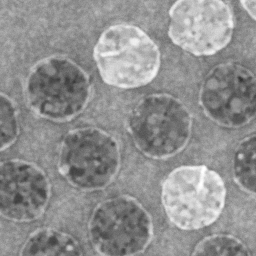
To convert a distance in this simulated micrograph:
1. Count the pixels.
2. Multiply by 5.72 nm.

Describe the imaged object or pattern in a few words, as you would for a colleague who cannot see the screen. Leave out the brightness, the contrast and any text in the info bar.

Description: raised bodies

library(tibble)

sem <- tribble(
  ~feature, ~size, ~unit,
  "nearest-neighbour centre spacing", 436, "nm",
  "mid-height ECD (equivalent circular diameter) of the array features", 355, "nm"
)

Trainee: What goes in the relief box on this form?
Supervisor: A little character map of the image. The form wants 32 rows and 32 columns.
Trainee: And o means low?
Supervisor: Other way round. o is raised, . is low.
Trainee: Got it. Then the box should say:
......................oooooo..oo
.....................oooooooo..o
.....................oooooooo...
..............ooo....oooooooo...
.............ooooo...oooooooo...
............ooooooo...oooooo....
............oooooooo....ooo.....
......ooo...oooooooo............
.....ooooo..oooooooo.......ooo..
....ooooooo..oooooo.......oooooo
...oooooooo...oooo.......ooooooo
...oooooooo..............ooooooo
o...ooooooo.......oooo...ooooooo
oo..oooooo.......oooooo..ooooooo
oo...oooo.......oooooooo..oooooo
oo..............oooooooo...oooo.
oo.......oooo...oooooooo........
oo......oooooo...oooooo.......oo
o.......ooooooo..oooooo.......oo
.......oooooooo....oo........ooo
oooo...oooooooo..............ooo
ooooo...ooooooo.......oooo...ooo
oooooo..oooooo.......ooooooo.ooo
oooooo....ooo.......oooooooo..oo
oooooo..............oooooooo....
oooooo......ooooo...oooooooo....
ooooo.......oooooo...oooooo.....
..oo.......oooooooo..oooooo.....
...........oooooooo....o........
....ooooo..oooooooo.......ooo...
...ooooooo..oooooo.......ooooo..
...ooooooo..ooooo.......ooooooo.